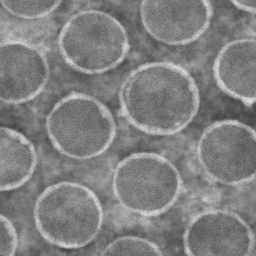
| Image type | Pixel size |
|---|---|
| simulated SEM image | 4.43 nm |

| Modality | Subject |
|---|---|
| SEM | raised bodies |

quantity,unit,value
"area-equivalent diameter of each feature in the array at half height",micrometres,0.29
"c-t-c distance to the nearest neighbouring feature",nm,374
